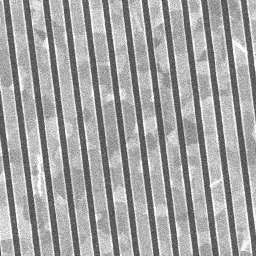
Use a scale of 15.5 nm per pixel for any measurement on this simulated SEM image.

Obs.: parallel lines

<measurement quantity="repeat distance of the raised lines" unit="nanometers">305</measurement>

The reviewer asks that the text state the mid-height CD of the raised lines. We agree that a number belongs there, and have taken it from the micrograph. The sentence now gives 0.2 microns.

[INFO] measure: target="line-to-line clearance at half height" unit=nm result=100